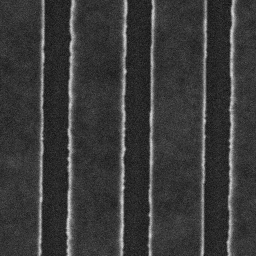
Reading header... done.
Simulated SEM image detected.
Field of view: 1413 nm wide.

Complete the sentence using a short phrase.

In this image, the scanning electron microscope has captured lines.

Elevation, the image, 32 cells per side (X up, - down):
XXXXX----XXXXXXX---XXXXXXX---XXX
XXXXX----XXXXXXX---XXXXXXX---XXX
XXXXX----XXXXXXX---XXXXXXX---XXX
XXXXX----XXXXXXX---XXXXXXX---XXX
XXXXX----XXXXXXX---XXXXXXX---XXX
XXXXX----XXXXXXX---XXXXXXX---XXX
XXXXX----XXXXXXX---XXXXXXX---XXX
XXXXX----XXXXXXX---XXXXXXX---XXX
XXXXX----XXXXXXX---XXXXXXX---XXX
XXXXX----XXXXXXX---XXXXXXX---XXX
XXXXX----XXXXXXX---XXXXXXX---XXX
XXXXX----XXXXXXX---XXXXXXX---XXX
XXXXX----XXXXXX----XXXXXXX---XXX
XXXXX----XXXXXX----XXXXXXX---XXX
XXXXX----XXXXXXX---XXXXXXX---XXX
XXXXX----XXXXXX----XXXXXXX---XXX
XXXXX----XXXXXX----XXXXXXX---XXX
XXXXX----XXXXXX----XXXXXXX---XXX
XXXXX----XXXXXX----XXXXXXX---XXX
XXXXX----XXXXXX----XXXXXXX---XXX
XXXXX----XXXXXX----XXXXXXX---XXX
XXXXX----XXXXXX----XXXXXXX---XXX
XXXXX----XXXXXX----XXXXXXX---XXX
XXXXX----XXXXXX----XXXXXX----XXX
XXXXX----XXXXXX----XXXXXX----XXX
XXXXX----XXXXXX----XXXXXX----XXX
XXXXX----XXXXXX----XXXXXX----XXX
XXXXX----XXXXXX----XXXXXX----XXX
XXXXX---XXXXXXX----XXXXXX----XXX
XXXXX---XXXXXXX----XXXXXX----XXX
XXXXX---XXXXXXX----XXXXXX---XXXX
XXXXX----XXXXXX----XXXXXX---XXXX